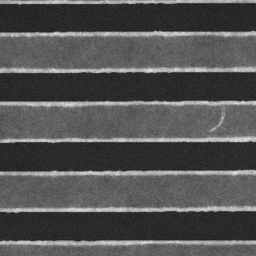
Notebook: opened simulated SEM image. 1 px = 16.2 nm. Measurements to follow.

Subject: lines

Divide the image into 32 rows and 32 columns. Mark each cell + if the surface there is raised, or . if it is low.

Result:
................................
................................
................................
................................
++++++++++++++++++++++++++++++++
++++++++++++++++++++++++++++++++
++++++++++++++++++++++++++++++++
++++++++++++++++++++++++++++++++
++++++++++++++++++++++++++++++++
................................
................................
................................
................................
++++++++++++++++++++++++++++++++
++++++++++++++++++++++++++++++++
++++++++++++++++++++++++++++++++
++++++++++++++++++++++++++++++++
++++++++++++++++++++++++++++++++
................................
................................
................................
..................++.+++.+++++++
++++++++++++++++++++++++++++++++
++++++++++++++++++++++++++++++++
++++++++++++++++++++++++++++++++
++++++++++++++++++++++++++++++++
................................
................................
................................
................................
++++++++++++++++++++++++++++++++
++++++++++++++++++++++++++++++++